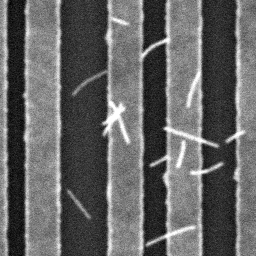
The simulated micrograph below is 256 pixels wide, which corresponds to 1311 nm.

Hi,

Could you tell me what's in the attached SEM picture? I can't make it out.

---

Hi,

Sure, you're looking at lines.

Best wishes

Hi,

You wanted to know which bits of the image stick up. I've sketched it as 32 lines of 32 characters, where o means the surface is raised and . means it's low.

o..oooo......ooooo...oooo.....oo
o..oooo.......oooo...oooo.....oo
o..oooo.......oooo...oooo.....oo
o..oooo.......oooo...oooo.....oo
o..oooo.......oooo...oooo.....oo
o..oooo.......oooo...oooo.....oo
o..oooo.......oooo...oooo.....oo
o..oooo.......oooo...oooo.....oo
o..oooo.......oooo...oooo.....oo
o..oooo.......oooo...oooo.....oo
o..oooo......ooooo...oooo.....oo
o..oooo......ooooo...oooo.....oo
o..oooo......ooooo...oooo.....oo
o..oooo......ooooo...oooo.....oo
o..oooo......ooooo...oooo.....oo
o..oooo......ooooo...oooo.....oo
o..oooo......ooooo...oooo.....oo
o..oooo.......oooo...oooo.....oo
o..oooo.......oooo...oooo.....oo
o..oooo......ooooo...oooo.....oo
o..oooo.......oooo...oooo.....oo
o..oooo.......oooo...oooo.....oo
o..oooo.......oooo...oooo.....oo
o..oooo.......oooo...oooo.....oo
o..oooo.......oooo...oooo.....oo
o..oooo.......oooo...oooo.....oo
o..oooo.......oooo...oooo.....oo
o..oooo.......oooo...oooo.....oo
o..oooo.......oooo...oooo.....oo
o..oooo.......oooo...oooo.....oo
o..oooo.......oooo...oooo.....oo
o..oooo......ooooo...oooo.....oo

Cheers